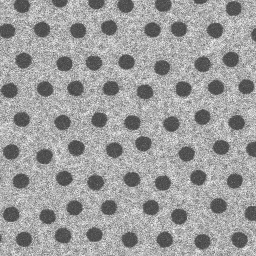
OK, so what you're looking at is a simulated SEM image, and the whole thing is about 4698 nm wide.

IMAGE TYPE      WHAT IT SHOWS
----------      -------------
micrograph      a regular array of holes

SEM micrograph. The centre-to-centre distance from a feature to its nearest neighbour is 534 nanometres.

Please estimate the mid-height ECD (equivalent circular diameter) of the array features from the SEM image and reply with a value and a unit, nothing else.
295 nanometres